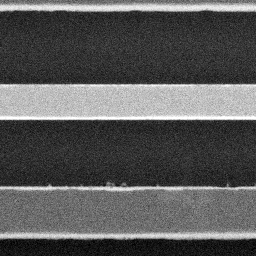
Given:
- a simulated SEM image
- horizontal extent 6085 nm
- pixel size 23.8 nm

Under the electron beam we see lines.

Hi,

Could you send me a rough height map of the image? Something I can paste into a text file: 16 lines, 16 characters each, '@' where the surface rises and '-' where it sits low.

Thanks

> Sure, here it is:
@@@@@@@@@@@@@@@@
----------------
----------------
----------------
----------------
@@@@@@@@@@@@@@@@
@@@@@@@@@@@@@@@@
----------------
----------------
----------------
----------------
----------------
@@@@@@@@@@@@@@@@
@@@@@@@@@@@@@@@@
@@@@@@@@@@@@@@@@
----------------